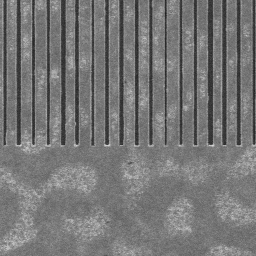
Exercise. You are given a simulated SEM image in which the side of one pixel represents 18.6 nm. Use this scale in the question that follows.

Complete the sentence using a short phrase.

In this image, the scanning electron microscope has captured parallel lines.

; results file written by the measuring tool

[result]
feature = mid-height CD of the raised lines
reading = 207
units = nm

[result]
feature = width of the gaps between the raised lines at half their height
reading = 69.9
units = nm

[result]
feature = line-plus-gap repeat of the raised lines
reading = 274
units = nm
